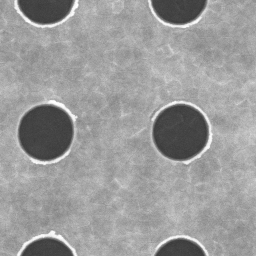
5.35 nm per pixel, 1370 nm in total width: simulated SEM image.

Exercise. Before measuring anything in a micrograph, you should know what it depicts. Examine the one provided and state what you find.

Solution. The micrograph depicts holes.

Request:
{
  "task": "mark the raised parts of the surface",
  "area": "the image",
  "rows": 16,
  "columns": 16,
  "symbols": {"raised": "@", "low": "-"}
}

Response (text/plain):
@---@@@@@@---@@@
@@@@@@@@@@@@@@@@
@@@@@@@@@@@@@@@@
@@@@@@@@@@@@@@@@
@@@@@@@@@@@@@@@@
@@@@@@@@@@@@@@@@
@@@@@@@@@@@@@@@@
@---@@@@@@---@@@
@----@@@@@---@@@
@@--@@@@@@--@@@@
@@@@@@@@@@@@@@@@
@@@@@@@@@@@@@@@@
@@@@@@@@@@@@@@@@
@@@@@@@@@@@@@@@@
@@@@@@@@@@@@@@@@
@@--@@@@@@--@@@@